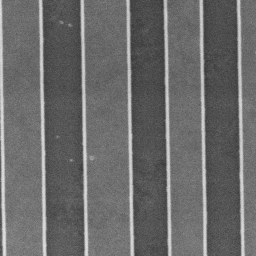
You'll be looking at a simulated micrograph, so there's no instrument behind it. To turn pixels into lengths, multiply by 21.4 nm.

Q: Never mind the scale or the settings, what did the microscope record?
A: groups of lines, slits or small figures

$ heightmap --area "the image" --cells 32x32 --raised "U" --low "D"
UUUUUDDDDDUUUUUUDDDDDUUUUDDDDDUU
UUUUUDDDDDUUUUUUDDDDDUUUUDDDDDUU
UUUUUDDDDDUUUUUUDDDDDUUUUDDDDDUU
UUUUUDDDDDUUUUUUDDDDDUUUUDDDDDUU
UUUUUDDDDDUUUUUUDDDDDUUUUDDDDDUU
UUUUUDDDDDUUUUUUDDDDDUUUUDDDDDUU
UUUUUDDDDDUUUUUUDDDDDUUUUDDDDDUU
UUUUUDDDDDUUUUUUDDDDDUUUUDDDDDUU
UUUUUDDDDDUUUUUUDDDDDUUUUDDDDDUU
UUUUUDDDDDUUUUUUDDDDDUUUUDDDDDUU
UUUUUDDDDDUUUUUUDDDDDUUUUDDDDDUU
UUUUUDDDDDUUUUUUDDDDDUUUUDDDDDUU
UUUUUDDDDDDUUUUUDDDDDUUUUDDDDDUU
UUUUUDDDDDDUUUUUDDDDDUUUUDDDDDUU
UUUUUDDDDDDUUUUUDDDDDUUUUDDDDDUU
UUUUUDDDDDDUUUUUDDDDDUUUUDDDDDUU
UUUUUDDDDDDUUUUUDDDDDUUUUDDDDDUU
UUUUUDDDDDDUUUUUDDDDDUUUUDDDDDUU
UUUUUDDDDDDUUUUUDDDDDUUUUDDDDDUU
UUUUUDDDDDDUUUUUDDDDDUUUUDDDDDUU
UUUUUDDDDDDUUUUUDDDDDUUUUUDDDDUU
UUUUUDDDDDDUUUUUDDDDDUUUUUDDDDUU
UUUUUDDDDDDUUUUUDDDDDUUUUUDDDDUU
UUUUUDDDDDDUUUUUDDDDDUUUUUDDDDUU
UUUUUDDDDDDUUUUUDDDDDUUUUUDDDDUU
UUUUUDDDDDDUUUUUDDDDDUUUUUDDDDUU
UUUUUUDDDDDUUUUUDDDDDUUUUUDDDDUU
DUUUUUDDDDDUUUUUDDDDDUUUUUDDDDUU
DUUUUUDDDDDUUUUUDDDDDUUUUUDDDDUU
DUUUUUDDDDDUUUUUUDDDDUUUUUDDDDUU
DUUUUUDDDDDUUUUUUDDDDUUUUUDDDDUU
DUUUUUDDDDDUUUUUUDDDDUUUUUDDDDUU